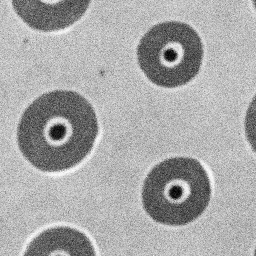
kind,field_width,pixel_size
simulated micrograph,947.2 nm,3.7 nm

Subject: ring-shaped grooves with a dot in the middle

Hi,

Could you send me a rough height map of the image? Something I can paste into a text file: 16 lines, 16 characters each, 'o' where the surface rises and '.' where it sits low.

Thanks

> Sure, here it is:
o.....oooooooooo
oo...ooooo..oooo
ooooooooo....ooo
ooooooooo....ooo
ooooooooo...oooo
oooooooooooooooo
oo....oooooooooo
o.....ooooooooo.
o.....ooooooooo.
o.....oooooooooo
oo..oooooo...ooo
ooooooooo....ooo
ooooooooo....ooo
ooooooooo...oooo
ooo..ooooooooooo
oo....oooooooooo